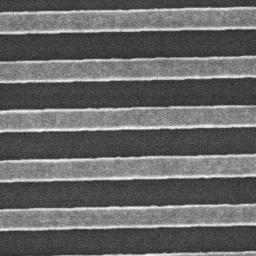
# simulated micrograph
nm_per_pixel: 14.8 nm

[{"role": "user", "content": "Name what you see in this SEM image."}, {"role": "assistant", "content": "lines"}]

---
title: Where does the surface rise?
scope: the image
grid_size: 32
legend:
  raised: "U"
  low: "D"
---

DDDDDDDDDDDDDDDDDDDDDDDDDDDDDDDD
DDDDUUUUUUUUUUUUUUUUUUUUUUUUUUUU
UUUUUUUUUUUUUUUUUUUUUUUUUUUUUUUU
UUUUUUUUUUUUUUUUUUUUUUUUUUUUUUUU
DDDDDDDDDDDDDDDDDDDDDDDDDDDDDDDD
DDDDDDDDDDDDDDDDDDDDDDDDDDDDDDDD
DDDDDDDDDDDDDDDDDDDDDDDDDDDDDDDD
DDDDDDDDDDUUUUUUUUUUUUUUUUUUUUUU
UUUUUUUUUUUUUUUUUUUUUUUUUUUUUUUU
UUUUUUUUUUUUUUUUUUUUUUUUUUUUUUUU
DDDDDDDDDDDDDDDDDDDDDDDDDDDDDDDD
DDDDDDDDDDDDDDDDDDDDDDDDDDDDDDDD
DDDDDDDDDDDDDDDDDDDDDDDDDDDDDDDD
DDDDDDDDDDDDDDDDUUUUUUUUUUUUUUUU
UUUUUUUUUUUUUUUUUUUUUUUUUUUUUUUU
UUUUUUUUUUUUUUUUUUUUUUUUUUUUUUUU
DDDDDDDDDDDDDDDDDDDDDDDDDDDDDDDD
DDDDDDDDDDDDDDDDDDDDDDDDDDDDDDDD
DDDDDDDDDDDDDDDDDDDDDDDDDDDDDDDD
DDDDDDDDDDDDDDDDDDDDDDDDUUUUUUUU
UUUUUUUUUUUUUUUUUUUUUUUUUUUUUUUU
UUUUUUUUUUUUUUUUUUUUUUUUUUUUUUUU
UUUUUUUUUUDDDDDDDDDDDDDDDDDDDDDD
DDDDDDDDDDDDDDDDDDDDDDDDDDDDDDDD
DDDDDDDDDDDDDDDDDDDDDDDDDDDDDDDD
DDDDDDDDDDDDDDDDDDDDDDDDDDDDDDDD
UUUUUUUUUUUUUUUUUUUUUUUUUUUUUUUU
UUUUUUUUUUUUUUUUUUUUUUUUUUUUUUUU
UUUUUUUUUUUUUUDDDDDDDDDDDDDDDDDD
DDDDDDDDDDDDDDDDDDDDDDDDDDDDDDDD
DDDDDDDDDDDDDDDDDDDDDDDDDDDDDDDD
DDDDDDDDDDDDDDDDDDDDDDDDDDDDDDUU